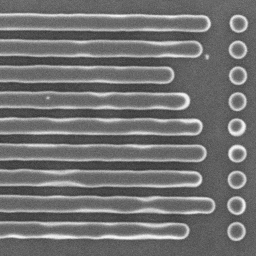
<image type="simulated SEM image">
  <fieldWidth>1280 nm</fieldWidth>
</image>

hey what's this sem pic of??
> groups of lines, slits or small figures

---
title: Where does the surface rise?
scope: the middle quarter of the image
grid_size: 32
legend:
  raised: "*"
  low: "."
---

................................
***************************.....
***************************.....
***************************.....
............**************......
................................
................................
********..*******************...
*******************************.
*******************************.
******************************..
................................
................................
................................
********************************
********************************
********************************
........................*****...
................................
................................
******************...***********
********************************
********************************
********************************
................................
................................
................................
********************************
********************************
********************************
....*************************...
................................